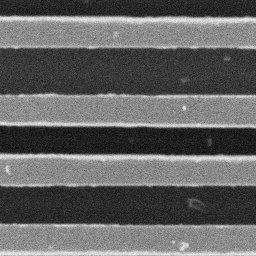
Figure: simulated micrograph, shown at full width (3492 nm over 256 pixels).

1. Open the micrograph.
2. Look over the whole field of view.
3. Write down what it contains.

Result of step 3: lines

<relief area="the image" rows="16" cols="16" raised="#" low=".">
................
################
################
................
................
................
################
################
................
................
################
################
................
................
################
################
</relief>